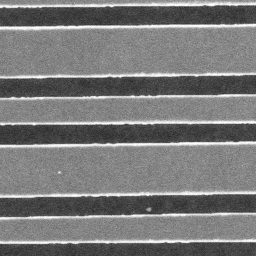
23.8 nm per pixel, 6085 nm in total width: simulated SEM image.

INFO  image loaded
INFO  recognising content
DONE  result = lines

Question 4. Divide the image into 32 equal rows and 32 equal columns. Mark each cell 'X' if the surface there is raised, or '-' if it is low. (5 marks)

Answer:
XXXXXXXXXXXXXXXXXXXXXXXXXXXXXXXX
--------------------------------
--------------------------------
----XXXXXXXXXXXXXXXXXXXXXXXXXXXX
XXXXXXXXXXXXXXXXXXXXXXXXXXXXXXXX
XXXXXXXXXXXXXXXXXXXXXXXXXXXXXXXX
XXXXXXXXXXXXXXXXXXXXXXXXXXXXXXXX
XXXXXXXXXXXXXXXXXXXXXXXXXXXXXXXX
XXXXXXXXXXXXXXXXXXXXXXXXXXXXXXXX
XXXXXXXXXXXXX-X-----------------
--------------------------------
--------------------------------
XXXXXXXXXXXXXXXXXXXXXXXXXXXXXXXX
XXXXXXXXXXXXXXXXXXXXXXXXXXXXXXXX
XXXXXXXXXXXXXXXXXXXXXXXXXXXXXXXX
----X---------------------------
--------------------------------
--------------------------------
XXXXXXXXXXXXXXXXXXXXXXXXXXXXXXXX
XXXXXXXXXXXXXXXXXXXXXXXXXXXXXXXX
XXXXXXXXXXXXXXXXXXXXXXXXXXXXXXXX
XXXXXXXXXXXXXXXXXXXXXXXXXXXXXXXX
XXXXXXXXXXXXXXXXXXXXXXXXXXXXXXXX
XXXXXXXXXXXXXXXXXXXXXXXXXXXXXXXX
XXXXXXXXXX-XXX------------------
--------------------------------
--------------------------------
XXXXXXXXXXXXXXXXXXXXXXXXXXXXXXXX
XXXXXXXXXXXXXXXXXXXXXXXXXXXXXXXX
XXXXXXXXXXXXXXXXXXXXXXXXXXXXXXXX
--------------------------------
--------------------------------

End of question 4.